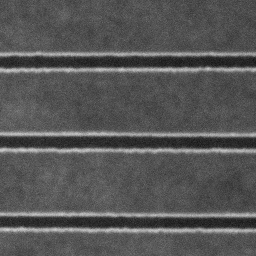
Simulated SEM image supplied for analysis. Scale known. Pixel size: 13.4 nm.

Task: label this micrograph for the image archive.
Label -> lines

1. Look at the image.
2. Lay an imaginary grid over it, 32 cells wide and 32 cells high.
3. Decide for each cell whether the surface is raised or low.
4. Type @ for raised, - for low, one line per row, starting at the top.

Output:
@@@@@@@@@@@@@@@@@@@@@@@@@@@@@@@@
@@@@@@@@@@@@@@@@@@@@@@@@@@@@@@@@
@@@@@@@@@@@@@@@@@@@@@@@@@@@@@@@@
@@@@@@@@@@@@@@@@@@@@@@@@@@@@@@@@
@@@@@@@@@@@@@@@@@@@@@@@@@@@@@@@@
@@@@@@@@@@@@@@@@@@@@@@@@@@@@@@@@
@@@@@@@@@@@@@@@@@@@@@@@@@@@@@@@@
--------------------------------
-------------------------@@-----
@@@@@@@@@@@@@@@@@@@@@@@@@@@@@@@@
@@@@@@@@@@@@@@@@@@@@@@@@@@@@@@@@
@@@@@@@@@@@@@@@@@@@@@@@@@@@@@@@@
@@@@@@@@@@@@@@@@@@@@@@@@@@@@@@@@
@@@@@@@@@@@@@@@@@@@@@@@@@@@@@@@@
@@@@@@@@@@@@@@@@@@@@@@@@@@@@@@@@
@@@@@@@@@@@@@@@@@@@@@@@@@@@@@@@@
@@@@@@@@@@@@@@@@@@@@@@@@@@@@@@@@
--------------------------------
--------------------------------
@@@@@@@@@@@@@@@@@@@@@@@@@@@@@@@@
@@@@@@@@@@@@@@@@@@@@@@@@@@@@@@@@
@@@@@@@@@@@@@@@@@@@@@@@@@@@@@@@@
@@@@@@@@@@@@@@@@@@@@@@@@@@@@@@@@
@@@@@@@@@@@@@@@@@@@@@@@@@@@@@@@@
@@@@@@@@@@@@@@@@@@@@@@@@@@@@@@@@
@@@@@@@@@@@@@@@@@@@@@@@@@@@@@@@@
@@@@@@@@@@@@@@@@@@@@@@@@@@@@@@@@
--------------------------------
--------------------------------
@@@@@@@@@@@@@@@@@@@@@@@@@@@@@@@@
@@@@@@@@@@@@@@@@@@@@@@@@@@@@@@@@
@@@@@@@@@@@@@@@@@@@@@@@@@@@@@@@@